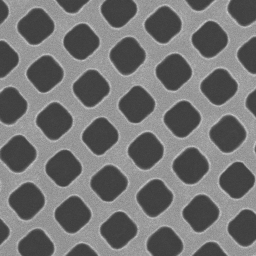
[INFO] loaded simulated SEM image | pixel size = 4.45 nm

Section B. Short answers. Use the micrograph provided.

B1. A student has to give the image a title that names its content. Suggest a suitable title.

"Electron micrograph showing a regular array of holes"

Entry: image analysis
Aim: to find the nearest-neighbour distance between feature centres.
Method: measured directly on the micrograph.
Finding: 212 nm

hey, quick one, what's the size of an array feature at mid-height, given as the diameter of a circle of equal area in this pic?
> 33.7 px